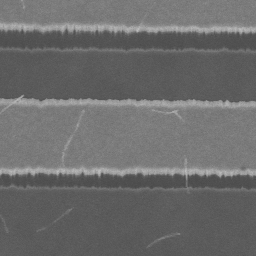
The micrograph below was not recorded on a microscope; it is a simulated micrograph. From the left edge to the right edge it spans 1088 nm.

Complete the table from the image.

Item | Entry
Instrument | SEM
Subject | lines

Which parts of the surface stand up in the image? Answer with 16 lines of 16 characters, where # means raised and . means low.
################
################
................
................
................
................
################
################
################
################
################
................
................
................
................
................